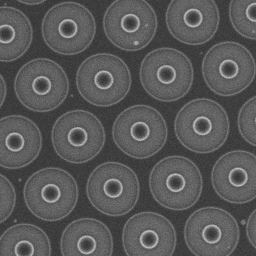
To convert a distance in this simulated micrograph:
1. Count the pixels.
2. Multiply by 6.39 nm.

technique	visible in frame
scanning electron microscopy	an array of small figures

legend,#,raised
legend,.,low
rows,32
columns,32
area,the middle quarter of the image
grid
####...........####......#......
####............###.....###.....
####....####....###.....####....
.##.....####....###.....####....
.##.....####....####.....##.....
.##.....###.....####...........#
.###............#####..........#
####...........#######........##
#####..........########......###
#######......###################
###################.##########..
################.......######...
.......#######..........#####...
........######...........###....
.........####............###....
.........####....####....###....
..###.....##.....####.....##....
.####.....##.....####.....##....
.#####....###.....##.....####...
.####.....###............####...
..........####...........######.
.........######........#########
........########......##########
.......###################....##
##...###################........
#########......########.........
########.........#####..........
.######...........####..........
..####............####....####..
...###.....###....####....####..
...###....####.....###....####..
...###....####.....###.....##...